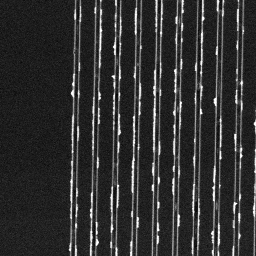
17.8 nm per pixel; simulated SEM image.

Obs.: parallel lines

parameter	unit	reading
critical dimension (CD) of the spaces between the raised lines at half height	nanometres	68.9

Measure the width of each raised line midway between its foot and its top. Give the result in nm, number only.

296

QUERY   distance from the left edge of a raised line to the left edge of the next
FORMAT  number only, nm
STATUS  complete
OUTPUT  362